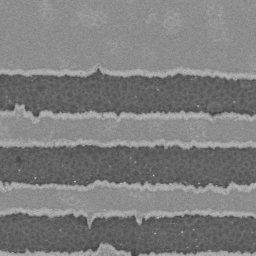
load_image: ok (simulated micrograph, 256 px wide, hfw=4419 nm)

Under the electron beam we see one or a few lines or trenches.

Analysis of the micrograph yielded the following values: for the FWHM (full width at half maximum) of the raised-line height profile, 478 nanometers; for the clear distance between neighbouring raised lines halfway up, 42.5 pixels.